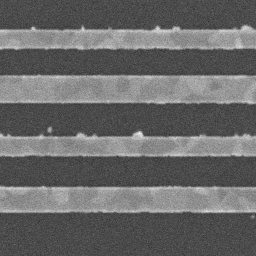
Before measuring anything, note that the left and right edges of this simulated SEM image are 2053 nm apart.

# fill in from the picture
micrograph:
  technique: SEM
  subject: lines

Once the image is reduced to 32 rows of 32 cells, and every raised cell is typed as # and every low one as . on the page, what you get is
................................
................................
................................
..............................#.
################################
################################
................................
................................
................................
................................
################################
################################
################################
................................
................................
................................
................................
################################
################################
................................
................................
................................
................................
################################
################################
################################
##.#.##........##...##..########
................................
................................
................................
................................
................................